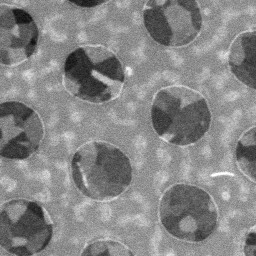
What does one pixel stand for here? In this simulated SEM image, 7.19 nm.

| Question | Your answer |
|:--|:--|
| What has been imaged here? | raised bodies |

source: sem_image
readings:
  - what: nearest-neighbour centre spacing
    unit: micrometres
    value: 0.693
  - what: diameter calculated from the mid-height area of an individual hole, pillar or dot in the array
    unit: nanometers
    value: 435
